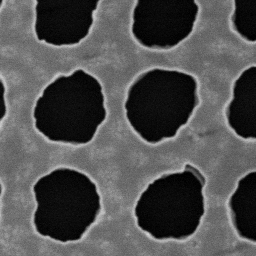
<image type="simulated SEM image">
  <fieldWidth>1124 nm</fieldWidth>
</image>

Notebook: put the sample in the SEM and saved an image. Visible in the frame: holes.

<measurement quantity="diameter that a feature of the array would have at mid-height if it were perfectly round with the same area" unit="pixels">70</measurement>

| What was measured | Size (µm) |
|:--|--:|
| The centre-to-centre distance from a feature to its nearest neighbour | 0.409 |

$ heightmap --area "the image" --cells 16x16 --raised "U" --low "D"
UUDDDDUUDDDDUUUD
UUDDDDUUDDDDUUUD
UUUDDUUUUDDUUUUU
UUUUUUUUUUUUUUUU
UUUUUUUUUDDUUUUD
UUUDDDUUDDDDUUUD
UUDDDDUUDDDDUUDD
UUDDDDUUDDDDUUDD
UUUDDDUUUDDUUUUD
UUUUUUUUUUUUUUUU
UUUUUUUUUUUUUUUU
UUDDDDUUUDDDDUUD
UUDDDDUUUDDDDUDD
UUDDDDUUUDDDDUUD
UUUDDUUUUDDDUUUD
UUUUUUUUUUUUUUUU